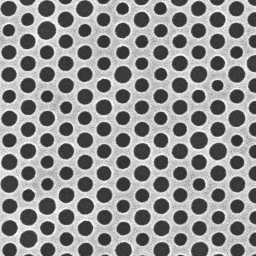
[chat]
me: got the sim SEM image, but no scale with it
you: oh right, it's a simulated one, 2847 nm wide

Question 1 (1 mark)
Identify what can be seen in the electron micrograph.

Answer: a regular array of holes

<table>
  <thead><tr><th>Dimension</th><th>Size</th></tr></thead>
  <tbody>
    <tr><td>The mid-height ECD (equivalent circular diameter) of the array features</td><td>168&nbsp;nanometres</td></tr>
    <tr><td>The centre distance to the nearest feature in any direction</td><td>242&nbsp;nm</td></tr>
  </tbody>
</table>